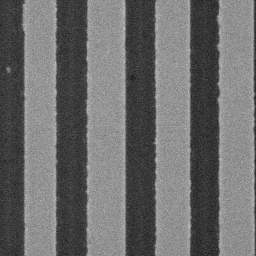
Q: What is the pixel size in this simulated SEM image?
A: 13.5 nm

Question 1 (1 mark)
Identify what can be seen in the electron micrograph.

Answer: lines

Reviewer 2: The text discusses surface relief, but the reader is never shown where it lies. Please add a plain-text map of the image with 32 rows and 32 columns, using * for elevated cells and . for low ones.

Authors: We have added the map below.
...****....*****...*****...*****
...****....*****...*****...*****
...****....*****...*****...*****
...****....*****...*****...*****
...****....*****...*****...*****
...****....*****...*****...*****
...****....*****...*****...*****
...****....*****...*****...*****
...****....*****...*****...*****
...****....*****...*****...*****
...****....*****...*****...*****
...****....*****...*****...*****
...****....*****...*****...*****
...****....*****...*****...*****
...****....*****....****...*****
...****....*****...*****...*****
...****....*****....****...*****
...****....*****...*****...*****
...****....*****...*****...*****
...****....*****...*****...*****
...****....*****...*****...*****
...****....*****...*****...*****
...****....*****...*****...*****
...****....*****...*****...*****
...****....*****...*****...*****
...****....*****....****...*****
...****....*****....****...*****
...****....*****....****...*****
...****....*****....****...*****
...****....*****...*****...*****
...****....*****...*****...*****
...****....*****...*****...*****